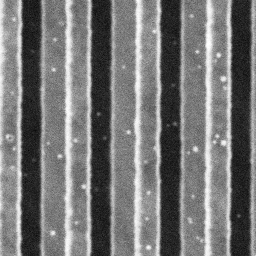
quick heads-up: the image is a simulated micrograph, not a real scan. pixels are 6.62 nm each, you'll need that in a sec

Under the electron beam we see lines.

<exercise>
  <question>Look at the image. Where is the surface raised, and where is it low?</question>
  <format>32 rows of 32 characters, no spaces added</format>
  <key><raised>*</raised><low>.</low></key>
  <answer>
***..******...******...******...
***..******...******...******...
***..******...******...******...
***..******...******...******...
***..******...******...******...
***..******...******...******...
***..******...******...******...
***..******...******...******...
***..******...******...******...
***..******...******...******...
***..******...******...******...
***..******...******...******...
***..******...******...******...
***..******...******...******...
***..******...******...******...
***..******...******...******...
***..******...******...******...
***..******...******...******...
***..******...******...******...
***..******...******...******...
***..******...******...******..*
***..******...******...******...
***..******...******...******...
***..******...******...******...
***..******...******...******..*
**...******...******...******...
***..******...******...******..*
***..******...******...******...
**...******...******...******..*
***..******...******...******..*
**...******...******...******..*
***..******...******...******..*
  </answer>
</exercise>